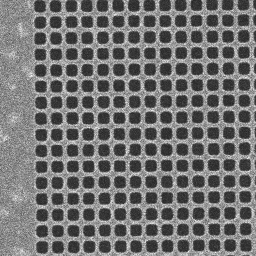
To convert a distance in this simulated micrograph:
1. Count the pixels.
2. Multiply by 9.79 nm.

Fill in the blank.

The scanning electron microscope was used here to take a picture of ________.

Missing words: a regular array of holes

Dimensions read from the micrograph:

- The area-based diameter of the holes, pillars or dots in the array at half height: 0.13 microns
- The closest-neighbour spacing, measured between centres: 149 nm